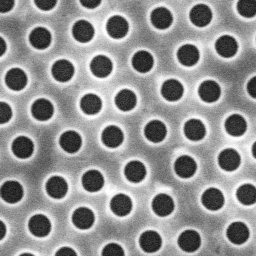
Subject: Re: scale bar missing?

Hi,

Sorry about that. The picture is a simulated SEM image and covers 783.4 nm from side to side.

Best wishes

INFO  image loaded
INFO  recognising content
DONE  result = a regular array of holes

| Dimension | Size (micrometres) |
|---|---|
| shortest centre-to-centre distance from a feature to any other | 0.118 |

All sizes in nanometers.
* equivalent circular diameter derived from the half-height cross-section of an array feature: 73.1